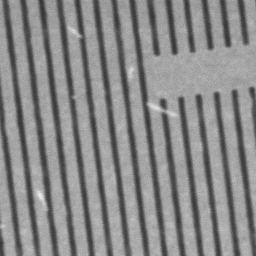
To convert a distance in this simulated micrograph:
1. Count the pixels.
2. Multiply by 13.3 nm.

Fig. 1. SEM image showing parallel lines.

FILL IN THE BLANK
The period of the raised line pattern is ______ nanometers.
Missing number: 239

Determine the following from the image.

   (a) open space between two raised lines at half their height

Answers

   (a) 97.2 nm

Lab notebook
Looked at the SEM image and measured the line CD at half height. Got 145 nm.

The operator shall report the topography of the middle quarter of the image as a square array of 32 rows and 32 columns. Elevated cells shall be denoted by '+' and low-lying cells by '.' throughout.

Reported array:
..++..+++..+++.+++..++++++++++++
..+++..++..+++..++..++++++++++++
..+++..++..+++..++...+++++++++++
..+++..++..+++..++...+++++++++++
..+++..+++..++..+++..+++++++++++
+..++..+++..++..+++..+++++++++++
+..++..+++..++..+++..+++++++++++
+..++..+++..+++.+++..+++++++++++
+..+++.+++..+++..++..+++.+++..++
+..+++..++..+++..++..+++..++..++
+..+++..++..+++..++..+++..++..++
+..+++..++..+++..++..+++..++...+
+..+++..+++..++..+++..++..+++..+
++..++..+++..++..+++..++..+++..+
++..++..+++..+++.+++..++..+++..+
++..++..+++..+++.+++..+++..++..+
++..+++..++..+++..++..+++..++..+
++..+++..++..+++..++..+++..++..+
++..+++..++..+++..++..+++..++...
+++.+++..++...++..+++..++..+++..
+++.+++..++...++..+++..++..+++..
+++..++..+++..++..+++..++..+++..
+++..++..+++..++...++..++..+++..
+++..++..+++..+++..++..++...++..
.++..+++..++..+++..++..+++..++..
.++..+++..++..+++..++..+++..++..
.++..+++..++..+++..+++..++..+++.
.++..+++..+++..++..+++..++..+++.
.++..+++..+++..++..+++..++..+++.
.+++..++..+++..++..+++..++..+++.
.+++..++..+++..+++.+++..++...++.
.+++..++..+++..+++.+++..++...++.